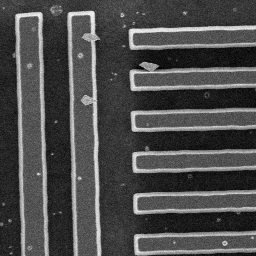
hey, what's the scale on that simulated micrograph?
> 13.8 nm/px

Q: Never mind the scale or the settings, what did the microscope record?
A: groups of lines, slits or small figures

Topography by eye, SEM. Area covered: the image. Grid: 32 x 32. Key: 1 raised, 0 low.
00000000000000000000000000000000
00000000000000000000000000000000
00111000011100000000000000000000
00111000011100000000000000010111
00111000011100001111111111111111
00111000011100001111111111111111
00111000011100000000000000000000
00111000011100000000000000000000
00111000011100000011000000000000
00111000011100001111111111111111
00111000011100000111111111111111
00111000011100000000000000000000
00111000011100000000000000000000
00111000011100000000000000000000
00111000011100000111111111111111
00111000011100000111111111111111
00011000011100000000000000000000
00011000011100000000000000000000
00011000011100000000000000000000
00011000011100000111111111111111
00011000011100000111111111111111
00011100011100000000000000000000
00011100011100000000000000000000
00011100011100000000000000000000
00011100011100000111111111111111
00011100011100000111111111111111
00011100011100000100000000000000
00011100011100000000000000000000
00011100011100000000000000000000
00011100011100000001111111111111
00011100011100000111111111111111
00011100001100000111110000000000